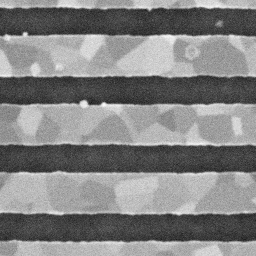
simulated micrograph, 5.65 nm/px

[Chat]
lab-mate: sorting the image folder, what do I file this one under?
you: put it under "lines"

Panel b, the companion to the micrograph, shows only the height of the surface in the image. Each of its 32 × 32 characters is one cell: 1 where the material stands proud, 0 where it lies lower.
11111111111111111111111111111111
00000000000000000000000000000000
00000000000000000000000000000000
00000000000000000000000000000000
11110011111111110000111100111100
11111111111111111111111111111111
11111111111111111111111111111111
11111111111111111111111111111111
11111111111111111111111111111111
11101111011111011000111100011111
00000000000000000000000000000000
00000000000000000000000000000000
00000000000000000000000000000000
11111111111111111111111111111111
11111111111111111111111111111111
11111111111111111111111111111111
11111111111111111111111111111111
11111111111111111111111111111111
00000000000000000000000000000000
00000000000000000000000000000000
00000000000000000000000000000000
00000001000000000000000000000000
11111111111111111111111111111111
11111111111111111111111111111111
11111111111111111111111111111111
11111111111111111111111111111111
11111111111111111111111111111111
00000000000000000000000000000000
00000000000000000000000000000000
00000000000000000000000000000000
11111111111111111111111111111111
11111111111111111111111111111111